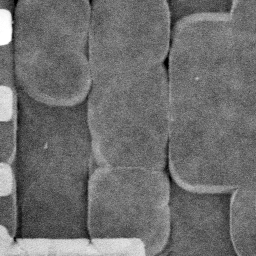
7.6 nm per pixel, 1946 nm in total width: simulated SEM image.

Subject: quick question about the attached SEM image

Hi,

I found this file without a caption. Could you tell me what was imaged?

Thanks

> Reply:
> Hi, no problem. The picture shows wiring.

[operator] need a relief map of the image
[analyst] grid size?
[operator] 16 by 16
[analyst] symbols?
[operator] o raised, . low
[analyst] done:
.ooooooooo....oo
oooooooooooooooo
oooooooooooooooo
.ooooooooooooooo
.ooooooooooooooo
o.oooooooooooooo
o.....oooooooooo
o.....oooooooooo
o.....oooooooooo
o.....oooooooooo
o.....oooooooooo
o.....oooo.ooooo
o.....oooo....oo
o.....oooo....oo
o.....oooo....oo
ooooooooo......o